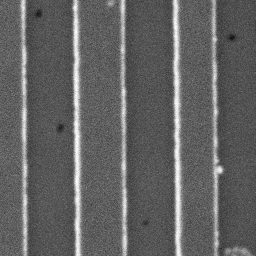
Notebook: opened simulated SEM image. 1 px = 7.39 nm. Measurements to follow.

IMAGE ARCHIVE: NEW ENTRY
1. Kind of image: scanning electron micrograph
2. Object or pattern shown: lines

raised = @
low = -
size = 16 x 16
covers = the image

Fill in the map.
@----@@@---@@---
@----@@@---@@---
@----@@@---@@---
@@---@@@---@@---
@----@@@---@@---
@@---@@@---@@---
@@---@@@---@@@--
@@---@@@---@@@--
@@---@@@---@@@--
@@---@@@---@@---
@@---@@@---@@@--
@@---@@@---@@@--
@@---@@@---@@@--
@@---@@@---@@@--
@@---@@@---@@@--
@@---@@@---@@@--